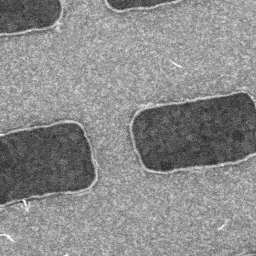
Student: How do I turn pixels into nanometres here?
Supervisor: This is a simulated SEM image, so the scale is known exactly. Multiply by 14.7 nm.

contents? raised bodies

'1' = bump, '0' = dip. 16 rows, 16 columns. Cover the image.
1111000110000000
1110000000000000
0000000000000000
0000000000000000
0000000000000000
0000000000000000
0000000000111111
0000000011111111
1111100011111111
1111110001111111
1111110001110000
1111110000000000
1100000000000000
0000000000000000
0000000000000000
0000000000000000